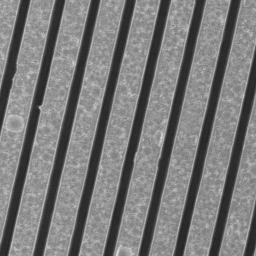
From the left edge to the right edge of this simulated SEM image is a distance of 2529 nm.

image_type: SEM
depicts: parallel lines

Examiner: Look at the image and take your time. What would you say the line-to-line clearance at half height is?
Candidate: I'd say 91.5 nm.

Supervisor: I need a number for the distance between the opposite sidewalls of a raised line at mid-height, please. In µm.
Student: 0.247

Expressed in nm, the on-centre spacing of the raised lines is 338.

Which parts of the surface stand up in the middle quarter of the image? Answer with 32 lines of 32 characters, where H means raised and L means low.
HHHLLHHHHHHHLLHHHHHHHLLHHHHHHLLL
HHHLLHHHHHHHLLHHHHHHLLLHHHHHHLLL
HHLLLHHHHHHLLLHHHHHHLLLHHHHHHLLH
HHLLLHHHHHHLLLHHHHHHLLHHHHHHHLLH
HHLLLHHHHHHLLHHHHHHHLLHHHHHHLLLH
HHLLHHHHHHHLLHHHHHHLLLHHHHHHLLLH
HHLLHHHHHHLLLHHHHHHLLLHHHHHHLLHH
HLLLHHHHHHLLLHHHHHHLLHHHHHHHLLHH
HLLLHHHHHHLLHHHHHHHLLHHHHHHLLLHH
HLLHHHHHHHLLHHHHHHHLLHHHHHHLLLHH
HLLHHHHHHLLLHHHHHHLLLHHHHHHLLLHH
LLLHHHHHHLLLHHHHHHLLLHHHHHHLLHHH
LLLHHHHHHLLHHHHHHHLLHHHHHHHLLHHH
LLLHHHHHHLLHHHHHHHLLHHHHHHLLLHHH
LLHHHHHHHLLHHHHHHLLLHHHHHHLLLHHH
LLHHHHHHLLLHHHHHHLLLHHHHHHLLHHHH
LLHHHHHHLLLHHHHHHLLHHHHHHHLLHHHH
LLHHHHHHLLHHHHHHHLLHHHHHHHLLHHHH
LHHHHHHHLLHHHHHHLLLHHHHHHLLLHHHH
LHHHHHHLLLHHHHHHLLLHHHHHHLLLHHHH
LHHHHHHLLLHHHHHHLLHHHHHHHLLHHHHH
LHHHHHHLLHHHHHHHLLHHHHHHHLLHHHHH
LHHHHHHLLHHHHHHHLLHHHHHHLLLHHHHH
HHHHHHHLLHHHHHHLLLHHHHHHLLLHHHHH
HHHHHHLLLHHHHHHLLHHHHHHHLLHHHHHH
HHHHHHLLLHHHHHHLLHHHHHHHLLHHHHHH
HHHHHHLLHHHHHHLLLHHHHHHLLLHHHHHH
HHHHHHLLHHHHHHLLLHHHHHHLLLHHHHHH
HHHHHLLLHHHHHHLLLHHHHHHLLHHHHHHH
HHHHHLLLHHHHHHLLHHHHHHHLLHHHHHHL
HHHHHLLLHHHHHHLLHHHHHHHLLHHHHHHL
HHHHHLLHHHHHHHLLHHHHHHLLLHHHHHHL